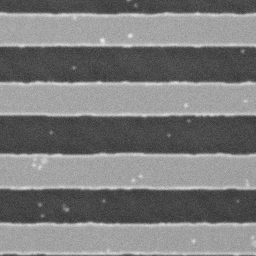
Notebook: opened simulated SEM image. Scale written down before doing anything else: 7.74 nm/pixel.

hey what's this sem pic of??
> lines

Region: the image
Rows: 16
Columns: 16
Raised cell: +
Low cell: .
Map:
................
++++++++++++++++
++++++++++++++++
................
................
++++++++++++++++
++++++++++++++++
................
................
................
++++++++++++++++
++++++++++++++++
................
................
++++++++++++++++
++++++++++++++++